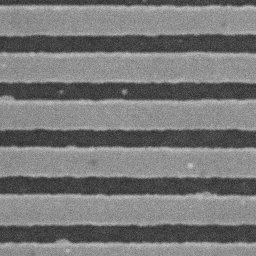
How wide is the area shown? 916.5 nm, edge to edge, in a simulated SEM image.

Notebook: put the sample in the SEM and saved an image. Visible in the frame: lines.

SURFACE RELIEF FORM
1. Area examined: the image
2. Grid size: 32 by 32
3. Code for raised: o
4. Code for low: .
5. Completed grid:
................................
oooooooooooooooooooooooooooooooo
oooooooooooooooooooooooooooooooo
oooooooooooooooooooooooooooooooo
................................
................................
................................
oooooooooooooooooooooooooooooooo
oooooooooooooooooooooooooooooooo
oooooooooooooooooooooooooooooooo
................................
................................
..........................o..o.o
oooooooooooooooooooooooooooooooo
oooooooooooooooooooooooooooooooo
oooooooooooooooooooooooooooooooo
................................
................................
ooooooo....oooo.....o...........
oooooooooooooooooooooooooooooooo
oooooooooooooooooooooooooooooooo
oooooooooooooooooooooooooooooooo
................................
................................
ooooooooooooo.oooooooooooo...o..
oooooooooooooooooooooooooooooooo
oooooooooooooooooooooooooooooooo
oooooooooooooooooooooooooooooooo
................................
................................
oooooooooooooooooooooooooooooooo
oooooooooooooooooooooooooooooooo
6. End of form